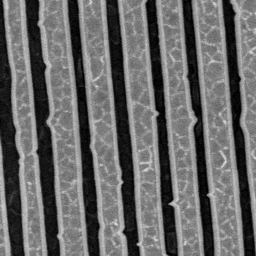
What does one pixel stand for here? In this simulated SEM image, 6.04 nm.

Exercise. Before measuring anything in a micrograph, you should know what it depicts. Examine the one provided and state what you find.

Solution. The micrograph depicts parallel lines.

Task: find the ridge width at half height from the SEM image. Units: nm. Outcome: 134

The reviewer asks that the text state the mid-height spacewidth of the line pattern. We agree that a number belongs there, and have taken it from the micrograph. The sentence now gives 97.9 nm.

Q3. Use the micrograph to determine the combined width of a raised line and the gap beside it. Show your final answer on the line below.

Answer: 0.233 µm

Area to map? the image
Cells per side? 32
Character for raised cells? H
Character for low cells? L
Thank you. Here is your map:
LHHLLHHHLLHHHLLHHHLLHHLLHHHLLHHH
LHHLLHHHLLHHHLLHHHLLHHHLHHHHLLHH
LHHLLHHHLLHHHLLHHHLLHHHLLHHHLLHH
LHHLLHHHLLHHHLLHHHLLHHHLLHHHLLHH
LHHLLHHHHLHHHLLHHHLLHHHLLHHHLLHH
LHHLLLHHHLHHHLLLHHLLHHHLLHHHLLHH
LHHLLLHHHLLHHLLLHHLLHHHLLHHHLLHH
LHHLLLHHHLLHHLLLHHLLHHHLLHHHLLHH
LLHHLLHHHLLHHHLLHHHLLHHLLHHHLLHH
LLHHLLHHHLLHHHLLHHHLLHHLLHHHLLHH
LLHHLLHHHLLHHHLLHHHLLHHLLHHHLLHH
LLHHLLHHHLLHHHLLHHHLLHHHLHHHLLHH
LLHHLLHHHLLHHHLLHHHLLHHHLHHHHLHH
LLHHLLHHHLLHHHLLHHHLLHHHLLHHHLLH
LLHHLLHHHLLHHHLLHHHLLHHHLLHHHLHH
LLHHLLHHHLLHHHLLHHHLLHHHLLHHHLHH
LLHHLLLHHHLLHHLLLHHLLHHHLLHHHLLH
LLHHLLLHHHLLHHLLLHHLLHHHLLHHHLLH
LLHHLLLHHHLLHHLLLHHLLHHHLLHHHLLH
LLLHLLLHHHLLHHHLLHHHLLHHLLHHHLLH
LLLHHLLHHHLLHHHLLHHHLLHHLLHHHLLH
LLLHHLLHHHLLHHHLLHHHLLHHLLHHHLLH
LLLHHLLHHHLLHHHLLHHHLLHHLLHHHLLH
LLLHHLLHHHLLHHHLLHHHLLHHLLHHHLLH
LLLHHLLHHHLLHHHLLHHHLLHHHLHHHHLL
LLLHHLLHHHLLHHHLLHHHLLHHHLLHHHLL
HLLHHLLHHHLLLHHLLHHHLLHHHLLHHHLL
HLLHHLLLHHLLLHHLLHHHLLHHHLLHHHLL
HLLHHLLLHHLLLHHLLHHHLLHHHLLHHHLL
HLLHHLLLHHLLLHHLLLHHLLHHHLLHHHLL
HLLHHLLLHHHLLHHLLLHHLLHHHLLHHHLL
HLLHHHLLHHHLLHHHLLHHHLLHHLLHHHLL